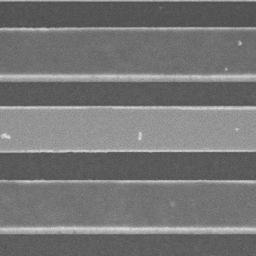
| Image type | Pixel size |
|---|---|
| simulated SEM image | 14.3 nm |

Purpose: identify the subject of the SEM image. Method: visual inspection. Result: lines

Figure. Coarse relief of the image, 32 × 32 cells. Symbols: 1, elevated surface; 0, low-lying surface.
00000000000000000000000000000000
00000000000000000000000000000000
00000000000000000000000000000000
00110100111111111111111111111111
11111111111111111111111111111111
11111111111111111111111111111111
11111111111111111111111111111111
11111111111111111111111111111111
11111111111111111111111111111111
11111111111111111111111111111111
00000000000000000000000000000000
00000000000000000000000000000000
00000000000000000000000000000000
11111111111111111111111111111111
11111111111111111111111111111111
11111111111111111111111111111111
11111111111111111111111111111111
11111111111111111111111111111111
11111111111111111111111111111111
00000000000000000000000000000000
00000000000000000000000000000000
00000000000000000000000000000000
00000000000000000000000000000000
11111111111111111111111111111111
11111111111111111111111111111111
11111111111111111111111111111111
11111111111111111111111111111111
11111111111111111111111111111111
11111111111111111111111111111111
00000000000000000000000000000000
00000000000000000000000000000000
00000000000000000000000000000000